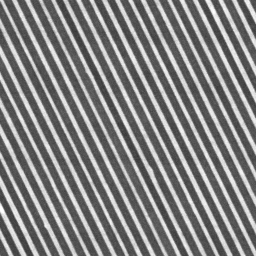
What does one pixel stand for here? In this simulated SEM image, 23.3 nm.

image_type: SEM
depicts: parallel lines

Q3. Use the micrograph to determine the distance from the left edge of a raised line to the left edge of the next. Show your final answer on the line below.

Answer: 270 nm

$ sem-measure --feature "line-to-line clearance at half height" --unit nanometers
194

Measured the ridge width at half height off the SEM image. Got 0.0863 microns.